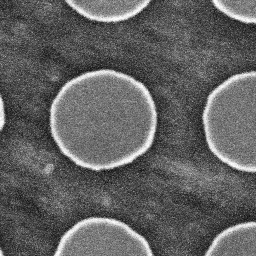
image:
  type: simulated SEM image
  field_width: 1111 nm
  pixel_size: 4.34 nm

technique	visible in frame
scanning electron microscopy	raised bodies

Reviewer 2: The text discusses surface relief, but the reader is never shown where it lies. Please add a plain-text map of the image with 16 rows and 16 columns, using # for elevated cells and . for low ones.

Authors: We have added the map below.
.....####.....##
................
................
................
................
....#####.....##
...#######...###
...#######...###
...######....###
....#####....###
......#........#
................
................
................
....####......##
....#####....###